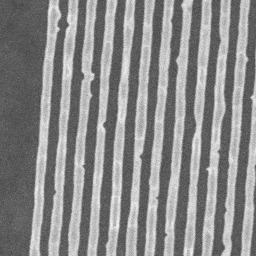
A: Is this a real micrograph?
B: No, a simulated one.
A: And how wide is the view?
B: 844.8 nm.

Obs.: parallel lines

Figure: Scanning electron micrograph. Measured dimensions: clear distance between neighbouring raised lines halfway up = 32.1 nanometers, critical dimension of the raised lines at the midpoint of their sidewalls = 0.0292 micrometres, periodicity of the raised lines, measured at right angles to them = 63.1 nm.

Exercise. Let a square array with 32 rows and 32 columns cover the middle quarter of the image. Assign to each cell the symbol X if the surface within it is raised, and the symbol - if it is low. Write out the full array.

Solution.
XX---XX--XXX---X---XX---XX---XX-
XX--XXX--XXX--XX---XX---XX--XX--
XX---XX--XX---XX---XX---XX--XX--
XX---XX--XX---XX---XX---XX--XX--
XX---XX--XX---XX---XX---XX--XX--
XX---XX--XX---XX---XX---XX--XX--
XX--XXX--XX---XX---XX--XXX--XX--
X---XXX--XX---XX---XX--XXX--XX--
XX--XXX--XX---XX--XXX--XXX--XX--
X---XX---XX---XX--XXX--XX---XX--
X---XX---XX---XX--XXX--XX---XX--
X---XX---XX---XX--XXX--XX---XX--
X---XX---X----XX--XXX--XX---XX--
X---XX---X---XX---XXX--XX---XX--
X---XX---X---XX---XXX--XX---XX--
X---XX--XX---XX---XXX--XX---XX--
X---XX--XX---XX---XX---XX---XX--
X--XX---XX---XX---XX---XX---XX--
X--XX---XX---XX---XX---XX---XX--
X--XX---XX---XX---XX--XXX--XXX--
X--XX---XX---XX---XX--XXX--XX---
X--XX---XX---XX---XX--XXX--XX---
---XX---XX---XX---X---XX---XX---
---XX---XX--XXX---X---XX---XX---
---XX---XX--XXX--XX---XX---XX---
---XX---XX--XXX---X---XX---XX---
---XX---XX--XX----X---XX---XX---
---XX---XX--XX---XX---XX---XX---
---XX--XX---XXX--XX---XX---XX---
---XX--XX---XX---XX--XXX---XX---
---XX--XX---XX---XX--XXX--XX----
---XX--XX---XX---XX--XXX--XX---X